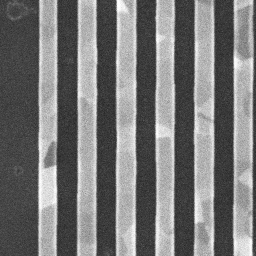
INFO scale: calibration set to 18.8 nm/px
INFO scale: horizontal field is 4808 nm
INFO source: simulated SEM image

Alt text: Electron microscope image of wiring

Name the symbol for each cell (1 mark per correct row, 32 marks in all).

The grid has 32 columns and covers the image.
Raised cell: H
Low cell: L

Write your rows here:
LLLLLHHLLLHHLLLHHLLLHHLLHHHLLHHH
LLLLLHHLLLHHLLLHHLLLHHLLHHHLLHHH
LLLLLHHLLLHHLLLHHLLLHHLLHHHLLHHH
LLLLLHHLLLHHLLLHHLLLHHLLHHHLLHHH
LLLLLHHLLLHHLLLHHLLLHHLLHHHLLHHH
LLLLLHHLLLHHLLLHHLLLHHLLHHHLLHHH
LLLLLHHLLLHHLLLHHLLLHHLLHHHLLHHH
LLLLLHHLLLHHLLLHHLLLHHLLHHHLLHHH
LLLLLHHLLLHHLLLHHLLLHHLLHHHLLHHH
LLLLLHHLLLHHLLLHHLLLHHLLHHHLLHHH
LLLLLHHLLLHHLLLHHLLLHHLLHHHLLHHH
LLLLLHHLLLHHLLLHHLLLHHLLHHHLLHHL
LLLLLHHLLLHHLLLHHLLLHHLLHHHLLHHL
LLLLLHHLLLHHLLLHHLLLHHLLHHHLLHHL
LLLLLHHLLLHHLLLHHLLLHHLLHHHLLHHL
LLLLLHHLLLHHLLLHHLLLHHLLHHHLLHHL
LLLLLHHLLLHHLLLHHLLLHHLLHHHLLHHL
LLLLLHHLLLHHLLLHHLLLHHLLHHHLLHHL
LLLLLHHLLLHHLLLHHLLLHHLLHHHLLHHL
LLLLLHHLLLHHLLLHHLLLHHLLHHHLLHHL
LLLLLHHLLLHHLLLHHLLLHHLLHHHLLHHL
LLLLLHHLLLHHLLLHHLLLHHLLHHHLLHHL
LLLLLHHLLLHHLLLHHLLLHHLLHHHLLHHL
LLLLLHHLLLHHLLLHHLLLHHLLHHHLLHHL
LLLLLHHLLLHHLLLHHLLLHHLLHHHLLHHL
LLLLLHHLLLHHLLLHHLLLHHLLHHHLLHHL
LLLLLHHLLLHHLLLHHLLLHHLLHHHLLHHL
LLLLLHHLLLHHLLLHHLLLHHLLHHHLLHHL
LLLLLHHLLLHHLLLHHLLLHHLLHHHLLHHL
LLLLLHHLLLHHLLLHHLLLHHLLHHHLLHHL
LLLLLHHLLLHHLLLHHLLLHHLLHHHLLHHL
LLLLLHHLLLHHLLLHHLLLHHLLHHHLLHHL